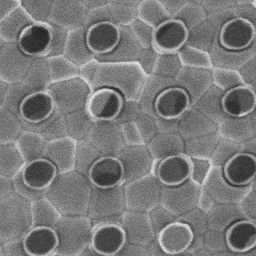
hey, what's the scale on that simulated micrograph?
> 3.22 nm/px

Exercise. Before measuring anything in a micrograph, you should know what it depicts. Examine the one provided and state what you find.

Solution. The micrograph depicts a regular array of raised bodies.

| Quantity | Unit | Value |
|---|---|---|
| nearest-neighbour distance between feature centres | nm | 216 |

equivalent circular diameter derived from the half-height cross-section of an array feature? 100 nm